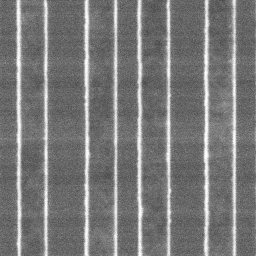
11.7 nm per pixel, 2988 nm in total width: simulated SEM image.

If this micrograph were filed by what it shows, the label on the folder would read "lines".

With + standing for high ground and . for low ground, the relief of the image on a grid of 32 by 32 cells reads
..++++.....+++...++++.....+++...
..++++.....+++...++++.....+++...
..++++.....+++...++++.....+++...
..++++.....+++...++++.....+++...
..++++.....+++...++++.....+++...
..++++.....+++...++++.....+++...
..++++.....+++...++++.....+++...
..++++.....+++...++++.....+++...
..++++.....+++....+++.....+++...
..++++.....+++....+++.....+++...
..++++.....+++...++++.....+++...
..++++.....+++...++++.....+++...
..++++.....+++...++++.....+++...
..++++.....+++....+++.....+++...
..++++.....+++...++++.....+++...
..++++.....+++...++++.....+++...
..++++.....+++...++++.....+++...
..++++.....+++...++++.....+++...
..++++.....+++...++++.....+++...
..++++.....+++...++++.....+++...
..++++.....+++...++++.....+++...
..++++.....+++...++++.....+++...
..++++.....+++...++++.....+++...
..++++.....+++...++++.....+++...
..++++.....+++...++++.....+++...
..++++.....+++....+++.....+++...
..++++.....+++....+++.....+++...
..++++.....+++....+++.....+++...
..++++.....+++....+++.....+++...
..++++.....+++....+++.....+++...
..++++.....+++....+++.....+++...
..++++.....+++....+++.....+++...